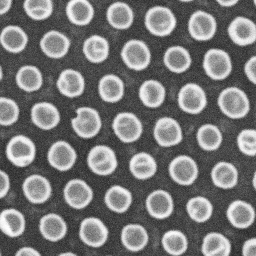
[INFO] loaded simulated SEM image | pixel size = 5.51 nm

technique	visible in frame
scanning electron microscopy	a regular array of raised bodies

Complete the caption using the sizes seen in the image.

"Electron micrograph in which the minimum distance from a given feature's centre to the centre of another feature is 224 nm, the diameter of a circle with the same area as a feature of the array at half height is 145 nm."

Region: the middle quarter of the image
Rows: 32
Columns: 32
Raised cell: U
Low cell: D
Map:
DDDDDDDDDDDDDDDDUUUUDDDDDDUUUUUD
DDDDDDDDDDDDDDDDDDDDDDDDDDDUUUDD
UUUUDDDDDDDDDDDDDDDDDDDDDDDDDDDD
UUUUDDDDDDUUUDDDDDDDDDDDDDDDDDDD
UUUUUDDDDUUUUUDDDDDDDUUDDDDDDDDD
UUUUUDDDDUUUUUUDDDDDUUUUDDDDDDUU
UUUUUDDDDUUUUUUDDDDUUUUUUDDDDUUU
UUUUDDDDDUUUUUUDDDDUUUUUUDDDDUUU
DDDDDDDDDDUUUUDDDDDUUUUUUDDDDUUU
DDDDDDDDDDDDDDDDDDDDUUUUDDDDDUUU
DDDDDDDDDDDDDDDDDDDDDDUDDDDDDUUU
DDDUUUUDDDDDDDDDDDDDDDDDDDDDDDUU
DDDDUUUUDDDDDDDUDDDDDDDDDDDDDDDD
DDDUUUUUUDDDDUUUUUDDDDDDDDDDDDDD
DDUUUUUUUDDDDUUUUUUDDDDDUUUUDDDD
DDUUUUUUUDDDUUUUUUUDDDDUUUUUUDDD
DDDUUUUUUDDDDUUUUUUDDDDUUUUUUDDD
DDDDUUUUDDDDDUUUUUUDDDDUUUUUUDDD
DDDDDDDDDDDDDDUUUUDDDDDUUUUUUDDD
DDDDDDDDDDDDDDDDDDDDDDDDUUUUUDDD
UDDDDDDDDDDDDDDDDDDDDDDDDDDDDDDD
UUDDDDDUUUUDDDDDDDDDDDDDDDDDDDDD
UUUDDDDUUUUUDDDDDDDUDDDDDDDDDDDD
UUUDDDUUUUUUUDDDDUUUUUDDDDDDDUUD
UUDDDDUUUUUUUDDDDUUUUUUDDDDUUUUU
UUDDDDUUUUUUUDDDDUUUUUUDDDDUUUUU
DDDDDDDUUUUUDDDDDUUUUUUDDDDUUUUU
DDDDDDDDDDDDDDDDDDUUUUDDDDDUUUUU
DDDDDDDDDDDDDDDDDDDDDDDDDDDUUUUU
DUUUUDDDDDDDDDDDDDDDDDDDDDDDUUUU
DUUUUUDDDDDDDDDDDDDDDDDDDDDDDDDD
UUUUUUUDDDDUUUUDDDDDDDDDDDDDDDDD